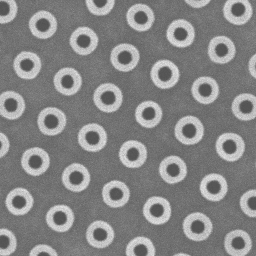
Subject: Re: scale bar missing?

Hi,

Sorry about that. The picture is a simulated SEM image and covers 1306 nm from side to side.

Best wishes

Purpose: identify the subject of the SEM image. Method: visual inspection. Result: a regular array of ring-shaped raised bodies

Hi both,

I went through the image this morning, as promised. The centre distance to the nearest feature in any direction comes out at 220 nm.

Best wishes